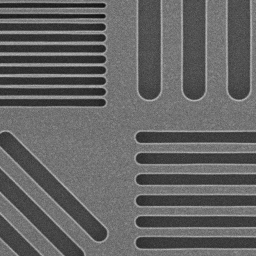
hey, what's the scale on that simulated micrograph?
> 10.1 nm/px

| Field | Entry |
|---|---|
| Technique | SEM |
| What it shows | groups of lines, slits or small figures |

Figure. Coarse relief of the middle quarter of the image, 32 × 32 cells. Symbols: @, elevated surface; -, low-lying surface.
----------@@@@@@@@------@@@@@@--
-----------@@@@@@@------@@@@@@--
----------@@@@@@@@------@@@@@@--
----------@@@@@@@@------@@@@@@--
-----------@@@@@@@------@@@@@@--
---------@@@@@@@@@------@@@@@@--
----------@@@@@@@@------@@@@@@--
----------@@@@@@@@@-----@@@@@@--
@@@@@@@@@@@@@@@@@@@@---@@@@@@@@-
-----------@@@@@@@@@@@@@@@@@@@@@
----------@@@@@@@@@@@@@@@@@@@@@@
@@@@@@@@@@@@@@@@@@@@@@@@@@@@@@@@
@@@@@@@@@@@@@@@@@@@@@@@@@@@@@@@@
@@@@@@@@@@@@@@@@@@@@@@@@@@@@@@@@
@@@@@@@@@@@@@@@@@@@@@@@@@@@@@@@@
@@@@@@@@@@@@@@@@@@@@@@@@@@@@@@@@
@@@@@@@@@@@@@@@@@@@@@@@@@@@@@@@@
@@@@@@@@@@@@@@@@@@--------------
@@@@@@@@@@@@@@@@@@--------------
@@@@@@@@@@@@@@@@@@@-------------
@@@@@@@@@@@@@@@@@@@@@@@@@@@@@@@@
@@@@@@@@@@@@@@@@@@@@@@@@@@@@@@@@
@@@@@@@@@@@@@@@@@@--------------
@@@@@@@@@@@@@@@@@@--------------
@@@@@@@@@@@@@@@@@@--------------
@@@@@@@@@@@@@@@@@@@@@@@@@@@@@@@@
@@@@@@@@@@@@@@@@@@@@@@@@@@@@@@@@
@@@@@@@@@@@@@@@@@@@-------------
@@@@@@@@@@@@@@@@@@--------------
@@@@@@@@@@@@@@@@@@--------------
@@@@@@@@@@@@@@@@@@@@@@@@@@@@@@@@
-@@@@@@@@@@@@@@@@@@@@@@@@@@@@@@@